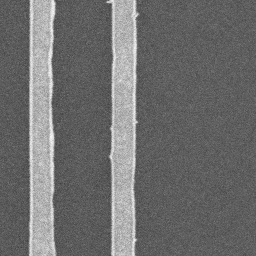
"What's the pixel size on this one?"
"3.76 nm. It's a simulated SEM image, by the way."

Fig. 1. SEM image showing one or a few lines or trenches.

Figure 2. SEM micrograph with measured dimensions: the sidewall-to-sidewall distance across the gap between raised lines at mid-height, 0.228 µm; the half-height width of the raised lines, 0.0802 µm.